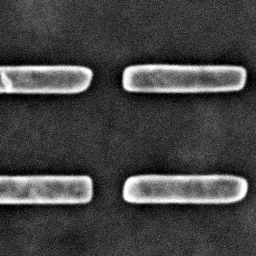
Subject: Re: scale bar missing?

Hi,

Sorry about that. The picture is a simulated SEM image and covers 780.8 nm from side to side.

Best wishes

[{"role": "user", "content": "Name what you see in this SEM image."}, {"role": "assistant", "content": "wiring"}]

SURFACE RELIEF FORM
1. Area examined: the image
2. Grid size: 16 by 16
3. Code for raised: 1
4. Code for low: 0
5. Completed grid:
0000000000000000
0000000000000000
0000000000000000
0000000000000000
1111100011111110
1111100011111110
0000000000000000
0000000000000000
0000000000000000
0000000000000000
0000000000000000
1111110011111110
1111100011111110
0000000000000000
0000000000000000
0000000000000000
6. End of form